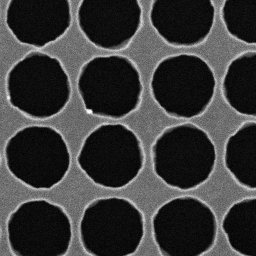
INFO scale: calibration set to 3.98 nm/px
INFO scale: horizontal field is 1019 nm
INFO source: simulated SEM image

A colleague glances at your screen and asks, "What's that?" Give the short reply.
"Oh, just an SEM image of holes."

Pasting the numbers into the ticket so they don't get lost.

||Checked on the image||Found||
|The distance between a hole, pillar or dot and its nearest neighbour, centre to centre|281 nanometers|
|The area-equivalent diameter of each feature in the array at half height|249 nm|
